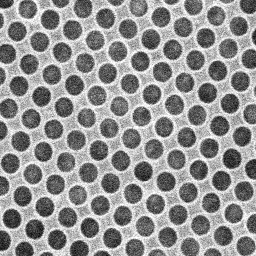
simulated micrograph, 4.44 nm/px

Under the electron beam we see a regular array of holes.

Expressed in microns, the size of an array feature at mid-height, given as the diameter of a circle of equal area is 0.0901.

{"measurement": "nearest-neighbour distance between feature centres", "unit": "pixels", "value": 24.4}